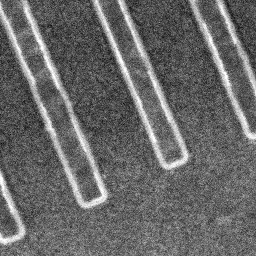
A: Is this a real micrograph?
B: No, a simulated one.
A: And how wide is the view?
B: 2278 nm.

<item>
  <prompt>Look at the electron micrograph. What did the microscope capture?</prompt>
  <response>one or a few lines or trenches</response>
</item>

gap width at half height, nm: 576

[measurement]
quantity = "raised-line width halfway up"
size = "228 nanometres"